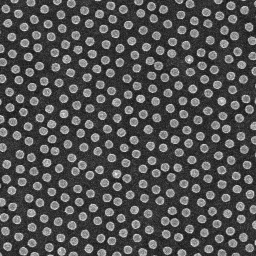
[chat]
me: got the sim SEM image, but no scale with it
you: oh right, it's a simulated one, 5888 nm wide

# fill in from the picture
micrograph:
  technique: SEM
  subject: a regular array of raised bodies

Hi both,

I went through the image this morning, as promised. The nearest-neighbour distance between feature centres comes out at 0.3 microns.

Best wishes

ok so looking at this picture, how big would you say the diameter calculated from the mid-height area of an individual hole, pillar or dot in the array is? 191 nm